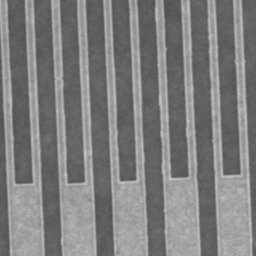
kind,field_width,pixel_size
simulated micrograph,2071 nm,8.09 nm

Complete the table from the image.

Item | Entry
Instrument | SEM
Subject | parallel lines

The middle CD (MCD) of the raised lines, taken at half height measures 6.24 px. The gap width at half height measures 158 nm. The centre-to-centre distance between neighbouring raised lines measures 210 nm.